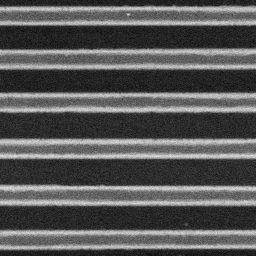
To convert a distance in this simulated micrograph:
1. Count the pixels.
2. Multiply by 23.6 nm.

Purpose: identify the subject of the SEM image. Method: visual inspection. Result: lines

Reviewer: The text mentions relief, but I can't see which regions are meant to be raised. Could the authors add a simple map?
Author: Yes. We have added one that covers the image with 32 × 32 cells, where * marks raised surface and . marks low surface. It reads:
................................
********************************
********************************
................................
................................
................................
********************************
********************************
................................
................................
................................
................................
********************************
********************************
................................
................................
................................
................................
********************************
********************************
................................
................................
................................
********************************
********************************
********************************
................................
................................
................................
********************************
********************************
................................